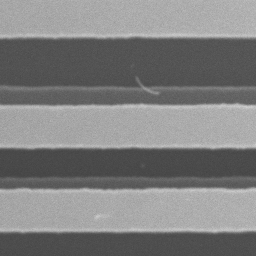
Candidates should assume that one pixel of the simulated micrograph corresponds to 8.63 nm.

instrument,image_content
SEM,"lines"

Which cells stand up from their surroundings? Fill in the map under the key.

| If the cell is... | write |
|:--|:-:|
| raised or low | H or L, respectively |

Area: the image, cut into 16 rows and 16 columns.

HHHHHHHHHHHHHHHH
HHHHHHHHHHHHHHHH
LLLLLLLLLLLLLLLL
LLLLLLLLLLLLLLLL
LLLLLLLLLLLLLLLL
HHHHHHHHHHHHHHHH
HHHHHHHHHHHHHHHH
HHHHHHHHHHHHHHHH
HHHHHHHHHHHHHHHH
LLLLLLLLLLLLLLLL
LLLLLLLLLLLLLLLL
HHHHHHHHHHHHHHHH
HHHHHHHHHHHHHHHH
HHHHHHHHHHHHHHHH
LHLHLLLHLLLLLHHL
LLLLLLLLLLLLLLLL